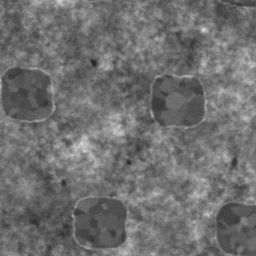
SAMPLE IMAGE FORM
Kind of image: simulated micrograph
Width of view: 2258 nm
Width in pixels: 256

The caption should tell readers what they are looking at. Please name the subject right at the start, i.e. raised bodies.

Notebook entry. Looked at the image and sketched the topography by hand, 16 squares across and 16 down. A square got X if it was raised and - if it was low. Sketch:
----------------
----------------
----------------
----------------
XXX-------------
XXX------XXXX---
XXX------XXXX---
-XX-------XXX---
----------------
----------------
----------------
----------------
-----XX---------
-----XXX------XX
-----XXX------XX
-----XX-------XX